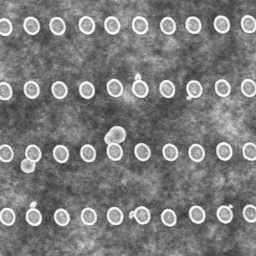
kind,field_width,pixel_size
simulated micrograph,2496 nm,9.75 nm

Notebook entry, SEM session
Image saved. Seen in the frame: a regular array of raised bodies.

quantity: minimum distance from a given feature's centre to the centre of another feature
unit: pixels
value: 26.7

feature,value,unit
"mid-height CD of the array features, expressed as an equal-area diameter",153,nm